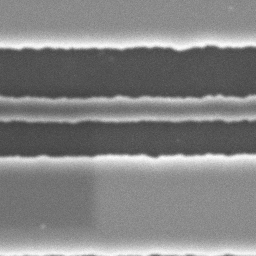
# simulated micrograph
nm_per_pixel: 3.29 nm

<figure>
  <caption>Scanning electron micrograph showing lines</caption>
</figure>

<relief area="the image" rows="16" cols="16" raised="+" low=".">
++++++++++++++++
++++++++++++++++
++++++++++++++++
................
................
................
++++++++++++++++
+++++++++++++.+.
................
................
++++++++++++++++
++++++++++++++++
++++++++++++++++
++++++++++++++++
++++++++++++++++
++++++++++++++++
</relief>